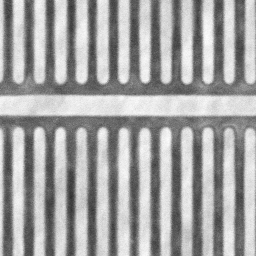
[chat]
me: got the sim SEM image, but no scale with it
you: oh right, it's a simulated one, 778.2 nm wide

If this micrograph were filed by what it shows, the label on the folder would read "groups of lines, slits or small figures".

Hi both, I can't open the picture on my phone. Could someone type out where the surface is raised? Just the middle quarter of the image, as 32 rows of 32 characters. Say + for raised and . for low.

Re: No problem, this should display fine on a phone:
...+++..+++...++...++...+++..+++
...+++..+++...++...++...+++..+++
...+++..+++...++...++...+++..+++
...+++..+++...++...++...+++..+++
....+....++...++....+....+....++
................................
................................
................................
++++++++++++++++++++++++++++++++
++++++++++++++++++++++++++++++++
++++++++++++++++++++++++++++++++
++++++++++++++++++++++++++++++++
++++++++++++++++++++++++++++++++
................................
................................
................................
....+....++...++...++...+++...++
...+++...++...++...++...+++..+++
...+++...++...++...++...+++..+++
...+++...++...++...++...+++..+++
...+++...++...++...+++..+++..+++
...+++...++...++...+++..+++..+++
...+++...++...++...+++..+++..+++
...+++..+++...++...+++..+++...++
...+++..+++...++...+++..+++...++
...+++..+++...++...+++..+++...++
...+++..+++...++...+++..+++..+++
...+++..+++...++...+++..+++..+++
...+++..+++...++...+++..+++..+++
...+++..+++...++...+++..+++..+++
...+++..+++...++...+++..+++..+++
...+++..+++...++...++...+++...++